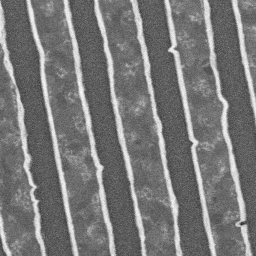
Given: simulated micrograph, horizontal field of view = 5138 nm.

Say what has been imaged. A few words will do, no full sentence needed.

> one or a few lines or trenches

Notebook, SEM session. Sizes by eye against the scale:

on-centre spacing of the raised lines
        1350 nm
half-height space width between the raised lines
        0.624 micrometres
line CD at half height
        0.72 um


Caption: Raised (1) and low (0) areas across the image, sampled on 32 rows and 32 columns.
00001111000011111000011111000111
00001111000011111000011111000011
00001111100011111000011111000011
00001111100001111000001111000011
00000111100001111000001111000011
00000111100001111100001111000011
10000111100001111100001111000011
10000111110000111100001111000001
10000111110000111100001111100001
11000111110000111100000111100001
11000011110000111110000111100001
11000011110000111110000111100001
11000011110000111110000111110000
11100011111000011110000111110000
11100011111000011110000011110000
11100011111000011111000011110000
11100001111000011111000011110000
11100001111000011111000011110000
11100001111100001111000011111000
11100001111100001111000011111000
11100001111100001111100001111000
11100000111100001111100001111000
11110000111100001111100001111000
11110000111110000111100001111100
11110000111110000111100001111100
11110000111110000111110001111100
11111000011110000111110000111100
11111000011110000111110000111100
11111000011111000011110000111100
11111000011111000011110000111110
01111000011111000011110000111110
01111000001111000011110000011110